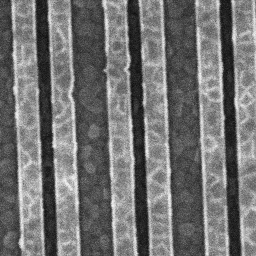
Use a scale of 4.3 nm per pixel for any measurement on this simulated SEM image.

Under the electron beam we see parallel lines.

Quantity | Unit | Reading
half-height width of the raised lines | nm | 97.8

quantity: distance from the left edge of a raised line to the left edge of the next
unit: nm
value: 198